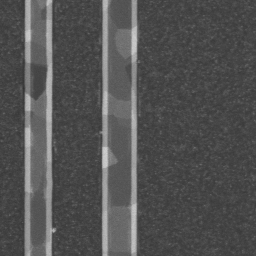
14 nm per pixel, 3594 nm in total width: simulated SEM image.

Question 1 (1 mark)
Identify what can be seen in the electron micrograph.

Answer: one or a few lines or trenches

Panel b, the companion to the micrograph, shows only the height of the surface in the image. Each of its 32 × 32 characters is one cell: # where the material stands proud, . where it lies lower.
...###.......####...............
...###.......####...............
...###.......####...............
...###.......####...............
...###.......####...............
...###.......####...............
...###.......####...............
...###.......####...............
...###.......####...............
...###.......####...............
...###.......####...............
...###.......####...............
...###.......####...............
...###.......####...............
...###.......####...............
...###.......####...............
...###.......####...............
...###.......####...............
...###.......####...............
...###.......####...............
...###.......####...............
...###.......####...............
...###.......####...............
...###.......####...............
...###.......####...............
...###.......####...............
...###.......####...............
...###.......####...............
...###.......####...............
...###.......####...............
...###.......####...............
...###.......####...............